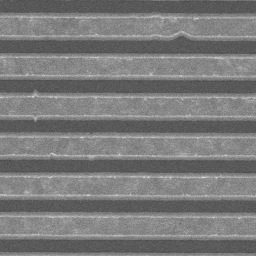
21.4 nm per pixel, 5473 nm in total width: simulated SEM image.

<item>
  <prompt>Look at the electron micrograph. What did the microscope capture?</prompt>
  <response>parallel lines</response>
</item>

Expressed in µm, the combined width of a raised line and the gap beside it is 0.853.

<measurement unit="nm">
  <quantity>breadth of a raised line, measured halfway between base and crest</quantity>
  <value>473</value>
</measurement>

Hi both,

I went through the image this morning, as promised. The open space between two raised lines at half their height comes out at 371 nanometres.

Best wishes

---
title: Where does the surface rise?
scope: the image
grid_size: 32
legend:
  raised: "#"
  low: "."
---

................................
................................
################################
################################
######################..########
................................
................................
################################
################################
################################
................................
................................
################################
################################
################################
................................
................................
################################
################################
################################
................................
................................
################################
################################
################################
................................
................................
################################
################################
################################
................................
................................